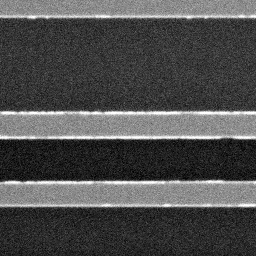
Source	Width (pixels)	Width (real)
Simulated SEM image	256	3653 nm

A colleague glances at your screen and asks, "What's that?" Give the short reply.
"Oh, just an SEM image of lines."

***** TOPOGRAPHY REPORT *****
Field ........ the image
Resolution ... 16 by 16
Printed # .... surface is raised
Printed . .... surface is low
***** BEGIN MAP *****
################
................
................
................
................
................
................
################
################
................
................
################
################
................
................
................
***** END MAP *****